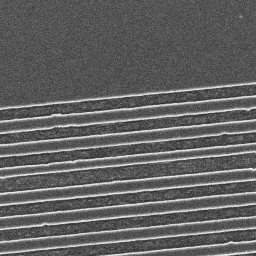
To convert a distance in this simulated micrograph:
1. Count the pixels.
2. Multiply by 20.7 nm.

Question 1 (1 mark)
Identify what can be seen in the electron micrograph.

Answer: parallel lines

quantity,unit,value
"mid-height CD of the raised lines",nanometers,247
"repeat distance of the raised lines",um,0.495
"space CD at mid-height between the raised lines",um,0.247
